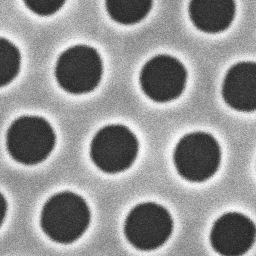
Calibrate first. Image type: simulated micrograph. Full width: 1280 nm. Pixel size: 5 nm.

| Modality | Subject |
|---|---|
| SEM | holes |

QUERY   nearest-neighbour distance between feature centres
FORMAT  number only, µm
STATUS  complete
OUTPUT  0.418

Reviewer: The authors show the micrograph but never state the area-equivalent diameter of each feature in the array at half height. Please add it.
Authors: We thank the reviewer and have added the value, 251 nm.